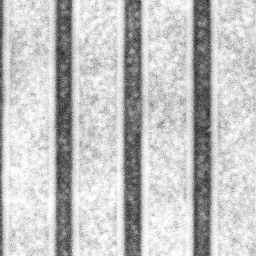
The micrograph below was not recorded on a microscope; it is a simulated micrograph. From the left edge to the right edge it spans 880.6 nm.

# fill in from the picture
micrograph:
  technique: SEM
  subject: one or a few lines or trenches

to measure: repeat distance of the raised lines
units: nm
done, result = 238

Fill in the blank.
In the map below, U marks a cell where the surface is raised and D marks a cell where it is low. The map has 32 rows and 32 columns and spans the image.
DUUUUUUDDDUUUUUDDDUUUUUUDDDUUUUU
DUUUUUUDDDUUUUUDDDUUUUUUDDDUUUUU
DUUUUUUDDDUUUUUDDDUUUUUUDDDUUUUU
DUUUUUUDDDUUUUUDDDUUUUUUDDDUUUUU
DUUUUUUDDDUUUUUDDDUUUUUUDDDUUUUU
DUUUUUUDDUUUUUUDDDUUUUUUDDDUUUUU
DUUUUUDDDUUUUUUDDDUUUUUUDDDUUUUU
DUUUUUUDDUUUUUUDDDUUUUUUDDDUUUUU
DUUUUUUDDUUUUUUDDDUUUUUUDDDUUUUU
DUUUUUUDDUUUUUUDDDUUUUUUDDDUUUUU
DUUUUUUDDUUUUUUDDDUUUUUUDDDUUUUU
DUUUUUUDDUUUUUUDDDUUUUUUDDDUUUUU
DUUUUUUDDUUUUUUDDDUUUUUUDDDUUUUU
DUUUUUUDDDUUUUUDDDUUUUUUDDDUUUUU
DUUUUUDDDDUUUUUDDDUUUUUUDDDUUUUU
DUUUUUDDDDUUUUUDDDUUUUUUDDDUUUUU
DUUUUUDDDDUUUUUDDDUUUUUUDDDUUUUU
DUUUUUUDDDUUUUUDDDUUUUUUDDDUUUUU
DUUUUUUDDDUUUUUDDDUUUUUUDDDUUUUU
DUUUUUUDDDUUUUUDDDUUUUUUDDDUUUUU
DUUUUUUDDDUUUUUDDDUUUUUUDDDUUUUU
DUUUUUUDDDUUUUUDDDUUUUUUDDDUUUUU
DUUUUUUDDDUUUUUDDDUUUUUUDDDUUUUU
DUUUUUUDDDUUUUUDDDUUUUUUDDDUUUUU
DUUUUUUDDUUUUUUDDDUUUUUUDDDUUUUU
DUUUUUUDDUUUUUUDDDUUUUUUDDDUUUUU
DUUUUUUDDDUUUUUDDDUUUUUUDDDUUUUU
DUUUUUUDDDUUUUUDDDUUUUUUDDDUUUUU
DUUUUUUDDDUUUUUDDDUUUUUUDDDUUUUU
DUUUUUUDDDUUUUUDDDUUUUUUDDDUUUUU
DUUUUUUDDDUUUUUDDDUUUUUUDDDUUUUU
DUUUUUUDDDUUUUUDDDUUUUUUDDDUUUUU